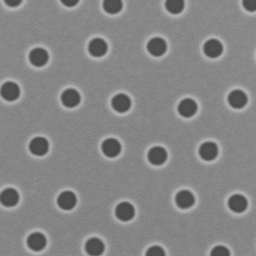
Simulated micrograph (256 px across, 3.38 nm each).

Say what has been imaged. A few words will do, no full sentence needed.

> a regular array of holes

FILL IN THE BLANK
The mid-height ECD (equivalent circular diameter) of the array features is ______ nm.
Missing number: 66.3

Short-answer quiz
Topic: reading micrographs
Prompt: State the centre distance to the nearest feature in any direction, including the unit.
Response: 0.173 µm